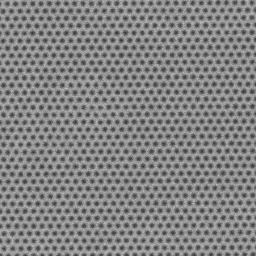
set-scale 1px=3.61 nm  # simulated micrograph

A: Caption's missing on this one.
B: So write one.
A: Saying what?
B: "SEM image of a regular array of holes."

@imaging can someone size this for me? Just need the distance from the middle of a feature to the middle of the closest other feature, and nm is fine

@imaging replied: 29.6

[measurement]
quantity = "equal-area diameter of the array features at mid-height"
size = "17.3 nm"